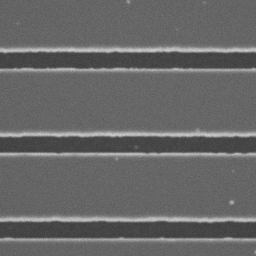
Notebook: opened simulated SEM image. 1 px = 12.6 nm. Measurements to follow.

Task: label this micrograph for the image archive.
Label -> lines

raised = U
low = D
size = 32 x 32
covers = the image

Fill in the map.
UUUUUUUUUUUUUUUUUUUUUUUUUUUUUUUU
UUUUUUUUUUUUUUUUUUUUUUUUUUUUUUUU
UUUUUUUUUUUUUUUUUUUUUUUUUUUUUUUU
UUUUUUUUUUUUUUUUUUUUUUUUUUUUUUUU
UUUUUUUUUUUUUUUUUUUUUUUUUUUUUUUU
UUUUUUUUUUUUUUUUUUUUUUUUUUUUUUUU
DDDDDDDDDDDDDDDDDDDDDDDDDDDDDDDD
DDDDDDDDDDDDDDDDDDDDDDDDDDDDDDDD
DDDDDDDDDDDDDDDDDDDDDDDDDDDDDDDD
UUUUUUUUUUUUUUUUUUUUUUUUUUUUUUUU
UUUUUUUUUUUUUUUUUUUUUUUUUUUUUUUU
UUUUUUUUUUUUUUUUUUUUUUUUUUUUUUUU
UUUUUUUUUUUUUUUUUUUUUUUUUUUUUUUU
UUUUUUUUUUUUUUUUUUUUUUUUUUUUUUUU
UUUUUUUUUUUUUUUUUUUUUUUUUUUUUUUU
UUUUUUUUUUUUUUUUUUUUUUUUUUUUUUUU
UUUUUUUUUUUUUUUUUUUUUUUUUUUUUUUU
DDDDDDDDDDDDDDDDDDDDDDDDDDDDDDDD
DDDDDDDDDDDDDDDDDDDDDDDDDDDDDDDD
UUUUUUUUUUUUUUUUUUUUUUUUUUUUUUUU
UUUUUUUUUUUUUUUUUUUUUUUUUUUUUUUU
UUUUUUUUUUUUUUUUUUUUUUUUUUUUUUUU
UUUUUUUUUUUUUUUUUUUUUUUUUUUUUUUU
UUUUUUUUUUUUUUUUUUUUUUUUUUUUUUUU
UUUUUUUUUUUUUUUUUUUUUUUUUUUUUUUU
UUUUUUUUUUUUUUUUUUUUUUUUUUUUUUUU
UUUUUUUUUUUUUUUUUUUUUUUUUUUUUUUU
UUUUUUUUUUUUUUUUUUUUUUUUUUUUUUUU
DDDDDDDDDDDDDDDDDDDDDDDDDDDDDDDD
DDDDDDDDDDDDDDDDDDDDDDDDDDDDDDDD
UUUUUUUUUUUUUUUUUUUUUUUUUUUUUUUU
UUUUUUUUUUUUUUUUUUUUUUUUUUUUUUUU